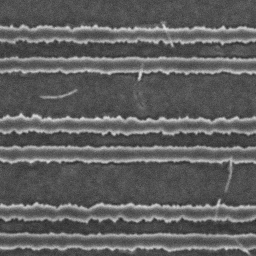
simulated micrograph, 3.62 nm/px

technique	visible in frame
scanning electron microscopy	lines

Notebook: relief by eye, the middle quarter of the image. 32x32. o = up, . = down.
oooooooooooooooooooooooooooooooo
oooooooooooooooooooooooooooooooo
...................o............
................................
................................
................................
................................
................................
................................
................................
................................
................................
................................
.o........o..o..o...............
oooooooooooooooooooooooooooooooo
oooooooooooooooooooooooooooooooo
oooooooooooooooooooooooooooooooo
............o..o.........ooo....
................................
................................
.o..............................
oooooooooooooooooooooooooooooooo
oooooooooooooooooooooooooooooooo
oooooooooooooooooooooooooooooooo
.....oo.ooo.oo.oo..............o
................................
................................
................................
................................
................................
................................
................................